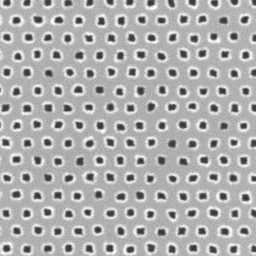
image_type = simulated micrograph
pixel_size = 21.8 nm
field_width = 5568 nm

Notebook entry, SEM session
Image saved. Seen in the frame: a regular array of holes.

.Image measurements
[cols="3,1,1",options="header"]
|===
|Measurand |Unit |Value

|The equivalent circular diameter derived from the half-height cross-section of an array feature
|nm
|187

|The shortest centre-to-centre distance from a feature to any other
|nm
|421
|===